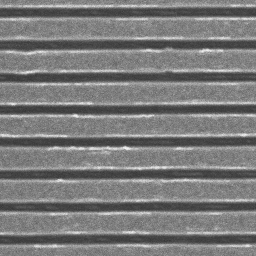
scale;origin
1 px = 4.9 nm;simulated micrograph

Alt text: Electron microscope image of parallel lines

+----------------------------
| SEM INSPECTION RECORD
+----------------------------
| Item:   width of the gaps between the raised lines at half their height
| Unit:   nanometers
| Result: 47.1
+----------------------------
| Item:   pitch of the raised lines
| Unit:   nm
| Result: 159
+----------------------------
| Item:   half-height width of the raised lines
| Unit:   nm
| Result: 111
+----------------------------